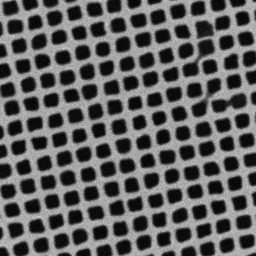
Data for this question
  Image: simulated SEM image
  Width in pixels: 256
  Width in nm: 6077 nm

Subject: a regular array of holes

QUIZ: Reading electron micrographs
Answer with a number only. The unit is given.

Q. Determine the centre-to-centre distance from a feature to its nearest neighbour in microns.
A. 0.463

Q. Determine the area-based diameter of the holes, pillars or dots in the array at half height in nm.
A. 373